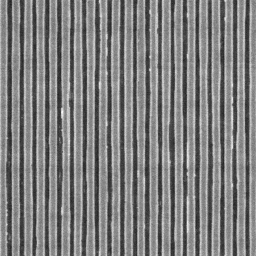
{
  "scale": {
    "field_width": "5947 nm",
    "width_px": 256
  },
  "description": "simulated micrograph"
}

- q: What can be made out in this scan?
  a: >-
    parallel lines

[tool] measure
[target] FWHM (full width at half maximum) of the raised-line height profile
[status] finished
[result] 0.16 µm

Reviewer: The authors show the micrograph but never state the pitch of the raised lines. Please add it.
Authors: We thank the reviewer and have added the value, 290 nm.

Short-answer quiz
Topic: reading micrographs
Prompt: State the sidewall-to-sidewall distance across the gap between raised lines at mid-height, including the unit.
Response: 6 pixels